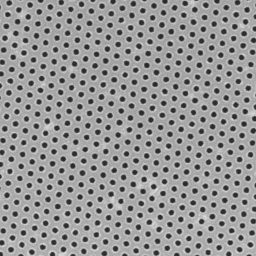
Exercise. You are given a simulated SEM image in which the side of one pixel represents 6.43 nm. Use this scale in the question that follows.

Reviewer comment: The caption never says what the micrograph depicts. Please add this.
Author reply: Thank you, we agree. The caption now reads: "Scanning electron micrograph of a regular array of holes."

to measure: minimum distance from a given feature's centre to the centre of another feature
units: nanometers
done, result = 74.4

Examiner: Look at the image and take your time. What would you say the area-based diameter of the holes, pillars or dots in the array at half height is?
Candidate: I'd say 37.7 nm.